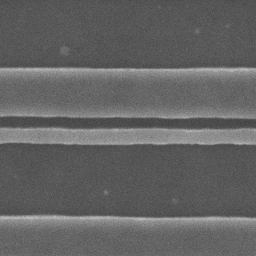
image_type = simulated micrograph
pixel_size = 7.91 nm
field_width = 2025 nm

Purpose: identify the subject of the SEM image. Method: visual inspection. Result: lines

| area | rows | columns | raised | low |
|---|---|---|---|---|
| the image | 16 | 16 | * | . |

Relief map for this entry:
................
................
................
................
****************
****************
****************
****************
****************
................
................
................
................
................
****************
****************